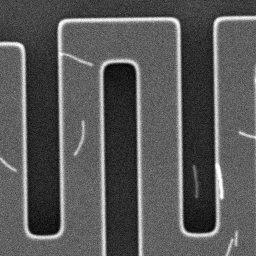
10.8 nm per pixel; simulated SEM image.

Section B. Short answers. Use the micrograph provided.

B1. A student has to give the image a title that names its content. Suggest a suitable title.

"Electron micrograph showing groups of lines, slits or small figures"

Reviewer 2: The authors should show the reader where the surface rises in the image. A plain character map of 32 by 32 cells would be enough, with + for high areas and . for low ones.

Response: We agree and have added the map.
................................
................................
............++++++++++.....+++++
.......+++++++++++++++.....+++++
.......+++++++++++++++.....+++++
++.....+++++++++++++++.....+++++
+++....+++++++++++++++.....+++++
+++....+++++++++++++++.....+++++
+++....++++++....+++++.....+++++
+++.....+++++....+++++.....+++++
+++.....+++++....+++++.....+++++
+++.....+++++....+++++.....+++++
+++.....+++++....++++++....+++++
+++.....+++++....++++++....+++++
+++.....+++++....++++++....+++++
+++.....+++++....++++++....+++++
+++.....+++++....++++++....+++++
+++.....+++++....++++++....+++++
+++.....+++++....++++++....+++++
+++.....+++++....++++++....+++++
+++.....+++++....++++++....+++++
+++.....+++++....++++++....+++++
+++.....+++++....++++++....+++++
+++.....+++++....++++++....+++++
+++.....+++++....++++++....+++++
+++.....+++++....++++++....+++++
+++.....+++++....++++++....+++++
+++.....+++++....++++++....+++++
+++.....+++++....++++++....+++++
+++++.+++++++....+++++++++++++++
+++++++++++++....+++++++++++++++
+++++++++++++....+++++++++++++++